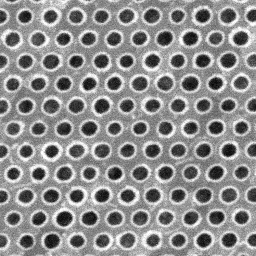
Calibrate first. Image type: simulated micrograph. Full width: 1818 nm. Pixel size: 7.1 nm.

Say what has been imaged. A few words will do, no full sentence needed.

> a regular array of holes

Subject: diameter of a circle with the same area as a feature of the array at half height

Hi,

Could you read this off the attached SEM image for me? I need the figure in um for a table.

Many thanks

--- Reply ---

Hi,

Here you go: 0.113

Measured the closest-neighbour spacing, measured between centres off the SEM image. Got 0.179 um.